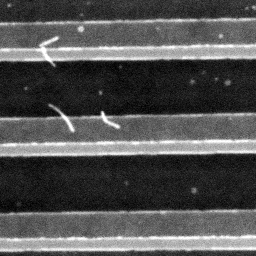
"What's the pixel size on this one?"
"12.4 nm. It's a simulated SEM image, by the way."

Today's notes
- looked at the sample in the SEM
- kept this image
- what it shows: lines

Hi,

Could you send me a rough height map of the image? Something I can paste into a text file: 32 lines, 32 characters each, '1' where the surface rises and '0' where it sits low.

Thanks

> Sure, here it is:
00000000000000000000000000000000
00000000000000000000000000000000
00000000000000000000000000000001
11111111111111111111111111111111
11111111111111111111111111111111
11111111111111111111111111111111
11111111111111111111111111111111
11111111000000000000000000000000
00000000000000000000000000000000
00000000000000000000000000000000
00000000000000000000000000000000
00000000000000000000000000000000
00000000000000000000000000000000
00000000000000000000000000000000
00000000000010000111111111111111
11111111111111111111111111111111
11111111111111111111111111111111
11111111111111111111111111111111
11111111111111111111111111111111
00000000000000000000000000000000
00000000000000000000000000000000
00000000000000000000000000000000
00000000000000000000000000000000
00000000000000000000000000000000
00000000000000000000000000000000
00000000000000000000000000000000
00000000000000000011111111111111
11111111111111111111111111111111
11111111111111111111111111111111
11111111111111111111111111111111
11111111111111111111111111111111
00000000000000000000000000000000